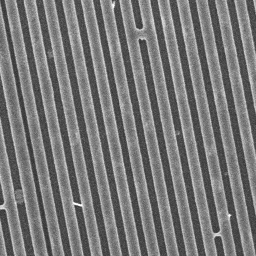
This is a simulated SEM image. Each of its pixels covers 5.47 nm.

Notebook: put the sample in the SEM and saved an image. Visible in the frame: parallel lines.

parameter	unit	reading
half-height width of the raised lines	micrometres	0.0591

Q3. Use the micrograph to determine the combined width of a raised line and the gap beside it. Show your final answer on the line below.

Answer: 18.7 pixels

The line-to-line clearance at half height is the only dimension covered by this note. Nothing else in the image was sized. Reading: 44.3 nanometres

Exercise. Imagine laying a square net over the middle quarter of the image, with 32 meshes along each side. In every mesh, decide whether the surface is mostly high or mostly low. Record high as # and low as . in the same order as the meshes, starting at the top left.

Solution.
#..##...##..###..###..###..##..#
#..###..##..###..###..###..##...
#..###..###..##..###..###..###..
#..###..###..###..##..###..###..
#...##..###..###..##..###..###..
##..##...##..###..###..##...##..
##..###..##..###..###..###..##..
##..###..###.###..###..###..##..
##..###..###..###.###..###..###.
##..###..###..###..###.###..###.
##...##..###..###..###..##...##.
###..##...##..###..###..###..##.
###..###..##..###..###..###..##.
###..###..###..##..###..###..###
.##..###..###..###..##..###..###
.##...##..###..###..###..##..###
.###..##...##..###..###..##...##
.###..###..##..###..###..###..##
.###..###..###..##..###..###..##
..##..###..###..###..##..###..##
..##...##..###..###..##...##..##
..###..##...##..###..###..###..#
..###..###..##..###..###..###..#
..###..###..###.###..###..###..#
...##..###..###..###.###..###..#
#..##..###..###..###..###.###..#
#..###..##..###..###..###..##...
#..###..###..##..###..###..##...
#..###..###..##..###..###..###..
#..###..###..###..##..###..###..
#...##..###..###..###..##..###..
##..##...##..###..###..###..##..